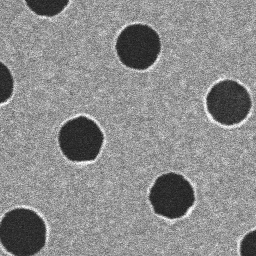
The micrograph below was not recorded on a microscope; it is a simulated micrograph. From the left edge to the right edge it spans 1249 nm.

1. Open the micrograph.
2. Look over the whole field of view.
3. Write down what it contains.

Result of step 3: holes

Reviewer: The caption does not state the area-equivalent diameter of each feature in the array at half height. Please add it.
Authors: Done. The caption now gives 223 nm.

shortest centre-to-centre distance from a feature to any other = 520 nanometers